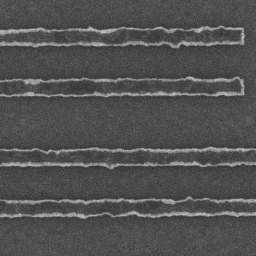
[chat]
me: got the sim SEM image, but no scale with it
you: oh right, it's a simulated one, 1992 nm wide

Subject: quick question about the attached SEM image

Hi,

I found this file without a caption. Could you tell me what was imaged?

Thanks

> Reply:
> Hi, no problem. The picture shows parallel lines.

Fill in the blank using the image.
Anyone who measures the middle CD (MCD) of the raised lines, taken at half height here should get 124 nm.